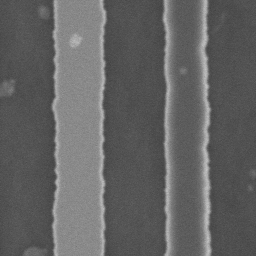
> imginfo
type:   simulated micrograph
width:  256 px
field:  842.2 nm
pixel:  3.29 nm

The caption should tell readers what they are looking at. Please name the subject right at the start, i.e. lines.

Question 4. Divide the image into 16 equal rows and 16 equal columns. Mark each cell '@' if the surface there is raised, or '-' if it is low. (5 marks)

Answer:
---@@@----@@@---
---@@@@---@@@---
---@@@----@@@---
---@@@----@@@---
---@@@----@@@---
---@@@----@@@---
---@@@----@@@---
---@@@----@@@---
----@@----@@@---
---@@@----@@@---
----@@----@@@---
----@@----@@@---
---@@@----@@@---
---@@@----@@@---
---@@@----@@@---
---@@@----@@@---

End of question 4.